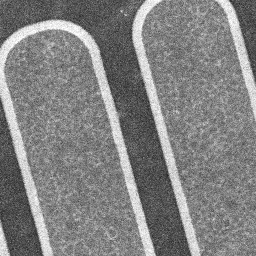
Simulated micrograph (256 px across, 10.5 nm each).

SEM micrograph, one or a few lines or trenches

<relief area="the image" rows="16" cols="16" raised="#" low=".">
.........#####..
.........######.
.####....######.
######...######.
######...######.
######...#######
#######...######
.######...######
.######...######
.#######...#####
..######...#####
..######...#####
..######...#####
..#######...####
...######...####
...######...####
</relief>